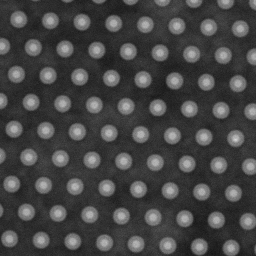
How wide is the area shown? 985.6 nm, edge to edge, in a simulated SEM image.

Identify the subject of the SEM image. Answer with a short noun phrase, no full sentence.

an array of small figures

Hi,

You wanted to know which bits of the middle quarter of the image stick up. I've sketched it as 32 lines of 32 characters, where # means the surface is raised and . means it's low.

................................
...##...........................
..####....####....###.....###...
..####....####....####....####..
..####....####....####....####..
...........##.....###.....###...
................................
................................
#.....###.......................
##....###.....###.....###.....##
##....####....###....####....###
#.....###.....###....####....###
...............#......###.....##
................................
................................
..###.....##....................
.####....####....####.....###...
.####....####....####....####...
..###.....###....####....####...
..................##......##....
................................
................................
#.....##......##................
#....####....####....###.....###
#....####....####....####....###
......##.....####....####....###
......................##.....###
................................
................................
.###.....###......#.............
.####....####....###.....###....
.####....####....####....####...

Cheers